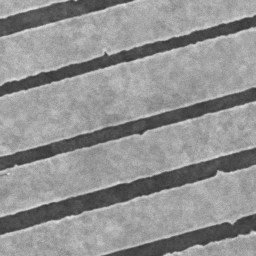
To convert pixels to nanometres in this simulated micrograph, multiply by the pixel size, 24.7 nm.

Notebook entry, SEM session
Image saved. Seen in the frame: one or a few lines or trenches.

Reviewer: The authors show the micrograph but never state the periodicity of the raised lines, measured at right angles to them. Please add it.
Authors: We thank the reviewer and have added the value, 1.58 µm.